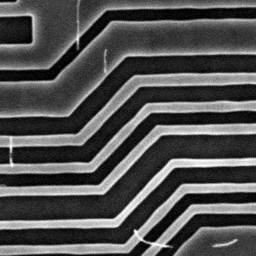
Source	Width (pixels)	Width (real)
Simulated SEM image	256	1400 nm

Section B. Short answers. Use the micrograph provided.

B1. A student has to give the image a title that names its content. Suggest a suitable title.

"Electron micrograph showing groups of lines, slits or small figures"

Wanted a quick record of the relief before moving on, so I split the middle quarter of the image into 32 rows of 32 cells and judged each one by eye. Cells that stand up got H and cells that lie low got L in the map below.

LHHHHHHHHHHHHLLLLLLLLLLLLLLLLLLL
HHHHHHHHHHHHLLLLLLLLLLLLLLLLLLLL
HHHHHHHHHHHLLLLLLLLLLLLLLLLLLLLL
HHHHHHHHHHLLLLLLLHHHHHHHHHHHHHHH
HHHHHHHHHLLLLLLLHHHHHHHHHHHHHHHH
HHHHHHHHLLLLLLLHHHHLLLLLLLLLLLLL
HHHHHHHLLLLLLLHHHHLLLLLLLLLLLLLL
HHHHHHLLLLLLLHHHHLLLLLLLLLLLLLLL
HHHHHLLLLLLLHHHHLLLLLLLLLLLLLLLL
HHHHLLLLLLLHHHHLLLLLLLLLLLLLLLLL
HHHLLLLLLLLHHHLLLLLLHHHHHHHHHHHH
HHLLLLLLLLHHHLLLLLLHHHHHHHHHHHHH
HHLLLLLLHHHHLLLLLLHHHLLLLLLLLLLL
LLLLLLLLHHHLLLLLLLHHLLLLLLLLLLLL
LLLLLLHHHHLLLLLLHHHLLLLLLLLLLLLL
LLLLLLHHHLLLLLLHHHLLLLLLLLLLLLLL
LLLLHHHHLLLLLLHHHLLLLLHHHHHHHHHH
LLLLHHHLLLLLLHHHLLLLLHHHHHHLLLLL
HHHHHHLLLLLLHHHLLLLLHHHLLLLLLLLL
HHHHHLLLLLLHHHLLLLLHHHLLLLLLLLLL
LLLLLLLLLLLHHLLLLLHHHLLLLLLLLLLL
LLLLLLLLLLHHHLLLLHHHLLLLLLLLLLLL
LLLLLLLLLHHHLLLLHHHLLLLLLLLLLLLL
LLLLLLLLHHHLLLLHHHLLLLLLLLLLLLLL
LLLLLLLHHHLLLLLHHHLLLLLLLLHHHHHH
HHHHHHHHHLLLLHHHHLLLLLLLLLHHHHHH
HHHHHHHHLLLLLHHHLLLLLLLLLHHLLLLL
LLLLLLLLLLLHHHHLLLLLLLLHHHLLLLLL
LLLLLLLLLLLHHHLLLLLLLLHHHLLLLLLL
LLLLLLLLLLHHHLLLLLLLLHHHLLLLLLLL
LLLLLLLLLHHHLLLLLLLLLHHLLLLLLHHH
HHHHHHHHHHHLLLLLLLLLHHLLLLLLHHHH